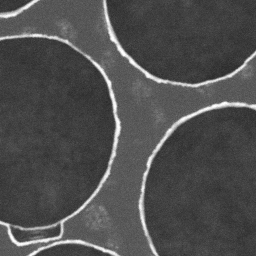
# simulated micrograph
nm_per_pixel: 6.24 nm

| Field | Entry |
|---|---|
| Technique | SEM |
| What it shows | holes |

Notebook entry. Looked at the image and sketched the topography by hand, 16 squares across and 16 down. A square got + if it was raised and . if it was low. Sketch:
.++++++.........
+++++++.........
....+++.........
.....+++........
......+++......+
.......+++++++++
.......+++++++++
.......+++++....
.......++++.....
.......+++......
.......++.......
......+++.......
.....++++.......
....+++++.......
+...+++++.......
+++...++++......